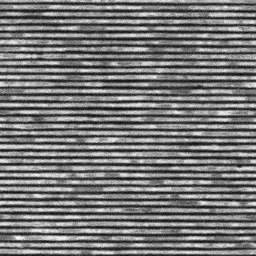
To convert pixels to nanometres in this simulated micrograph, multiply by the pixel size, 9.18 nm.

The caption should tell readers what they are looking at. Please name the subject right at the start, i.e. parallel lines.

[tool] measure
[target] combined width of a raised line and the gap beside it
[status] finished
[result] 64.2 nanometres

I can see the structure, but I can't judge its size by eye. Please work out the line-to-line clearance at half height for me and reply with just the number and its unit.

40.2 nm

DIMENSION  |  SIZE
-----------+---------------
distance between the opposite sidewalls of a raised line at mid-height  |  25.2 nm